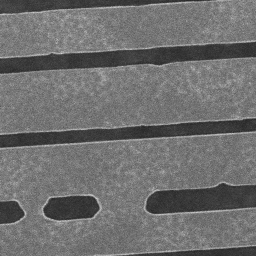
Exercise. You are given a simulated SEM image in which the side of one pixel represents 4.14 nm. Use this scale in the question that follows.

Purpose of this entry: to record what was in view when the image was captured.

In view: one or a few lines or trenches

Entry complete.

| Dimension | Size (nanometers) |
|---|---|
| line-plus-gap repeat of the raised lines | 284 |